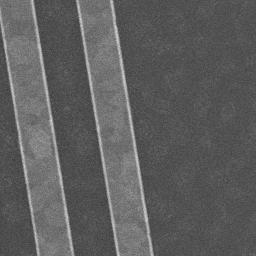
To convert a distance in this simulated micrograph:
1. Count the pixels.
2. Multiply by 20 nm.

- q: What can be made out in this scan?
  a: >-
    one or a few lines or trenches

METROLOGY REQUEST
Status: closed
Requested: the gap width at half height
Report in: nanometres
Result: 905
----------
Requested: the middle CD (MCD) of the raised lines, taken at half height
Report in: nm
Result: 661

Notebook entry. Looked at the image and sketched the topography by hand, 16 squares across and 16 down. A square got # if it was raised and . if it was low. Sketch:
##...##.........
##...##.........
##...##.........
###..###........
.##...##........
.##...##........
.##...##........
.##...##........
.##...##........
.###..##........
..##...##.......
..##...##.......
..##...##.......
..##...##.......
..##...##.......
..##...##.......